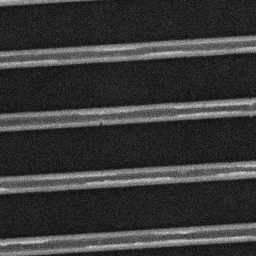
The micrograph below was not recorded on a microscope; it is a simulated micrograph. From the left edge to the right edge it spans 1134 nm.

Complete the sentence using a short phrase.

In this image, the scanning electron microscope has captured one or a few lines or trenches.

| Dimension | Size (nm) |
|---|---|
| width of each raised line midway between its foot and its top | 56.8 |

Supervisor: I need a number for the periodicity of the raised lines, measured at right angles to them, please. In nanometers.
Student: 277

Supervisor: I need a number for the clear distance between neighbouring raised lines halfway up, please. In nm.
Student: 219